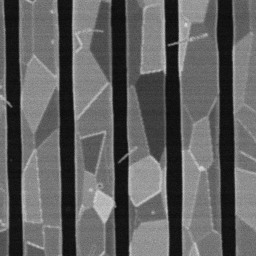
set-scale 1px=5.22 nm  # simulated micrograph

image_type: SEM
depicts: wiring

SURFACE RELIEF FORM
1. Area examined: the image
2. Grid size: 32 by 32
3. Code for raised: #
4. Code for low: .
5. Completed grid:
..#####..#####..####..#####..###
..#####..#####..####..#####..###
..#####..#####..####...####..###
#.#####..#####..####...####..###
#.#####..#####..####...####..###
#..####..#####..####..#####..###
#..####..#####..####...####..###
#..####..#####..#####.#####..###
#..####..#####..#####..####..###
#..####..#####..####...####..###
#..####..#####..####...####..###
#..####..#####..####...####..###
#..####..#####..####...####..###
#..####..#####..#####..####..###
#..####..#####..#####..####..###
#..####..#####..#####..####..###
#..####..#####..#####..####..###
#..####..#####..#####..####..###
#..####..#####..#####..####..###
#..#.##..#####..#####..####..###
#....##..#####..#####..####..###
#....##...####..#####..####..###
#....##...####..#####..####..###
#....###..####..#####..####...##
#....###..####..#####..####...##
#....###..####..#####..#####..##
#....###..####..#####..#####..##
#....###..####..#####..#####..##
#..###.#..####..#####..#####..##
#..##.....####..#####..#####..##
#..##.....####..#####..#####..##
#.........####..#####..#####..##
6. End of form